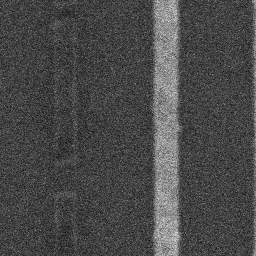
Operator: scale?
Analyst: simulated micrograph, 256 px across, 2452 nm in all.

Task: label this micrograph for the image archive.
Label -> one or a few lines or trenches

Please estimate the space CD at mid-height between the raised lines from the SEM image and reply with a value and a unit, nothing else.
767 nm